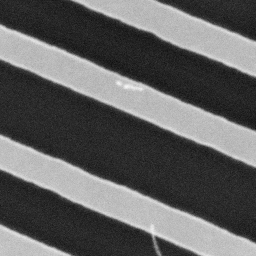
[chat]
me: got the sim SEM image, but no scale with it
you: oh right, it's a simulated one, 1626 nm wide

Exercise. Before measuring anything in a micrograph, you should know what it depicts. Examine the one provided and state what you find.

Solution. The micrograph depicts lines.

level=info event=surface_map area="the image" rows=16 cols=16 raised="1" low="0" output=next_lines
0000001111100000
0000000011111000
1100000000111111
1111100000000111
0011111000000001
0000111110000000
0000000111110000
0000000001111100
0000000000011111
1100000000000011
1111100000000000
0011111000000000
0000111111000000
0000000111110000
1000000001111100
1110000000001111